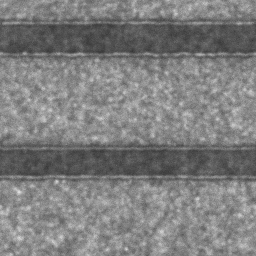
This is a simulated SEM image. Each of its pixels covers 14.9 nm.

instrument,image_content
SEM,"one or a few lines or trenches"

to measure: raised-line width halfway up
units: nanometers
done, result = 453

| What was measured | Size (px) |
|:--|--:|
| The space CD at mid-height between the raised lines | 93.4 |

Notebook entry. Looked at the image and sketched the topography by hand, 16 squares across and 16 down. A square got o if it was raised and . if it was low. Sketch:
................
oooooooooooooooo
oooooooooooooooo
................
................
................
................
................
................
oooooooooooooooo
oooooooooooooooo
................
................
................
................
................